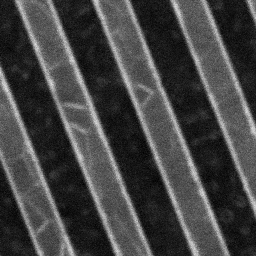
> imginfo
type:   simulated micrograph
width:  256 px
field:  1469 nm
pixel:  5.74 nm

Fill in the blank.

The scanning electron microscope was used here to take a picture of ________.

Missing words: one or a few lines or trenches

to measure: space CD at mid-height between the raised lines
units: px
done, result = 41.4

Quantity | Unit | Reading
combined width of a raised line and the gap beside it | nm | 414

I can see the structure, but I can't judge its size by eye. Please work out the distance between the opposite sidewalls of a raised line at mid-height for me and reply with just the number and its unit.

180 nm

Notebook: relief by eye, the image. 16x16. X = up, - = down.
-XX---XX---XX---
--XX--XXX--XX---
--XX---XX---XX--
--XX---XX---XX--
---XX---XX---X--
---XX---XX---XX-
X---XX--XXX--XX-
X---XX---XX---XX
XX--XX---XX---XX
XX---XX---XX--XX
XX---XX---XX---X
-XX---XX--XX---X
-XX---XX---XX---
--XX--XX---XX---
--XX---XX---XX--
--XX---XX---XX--